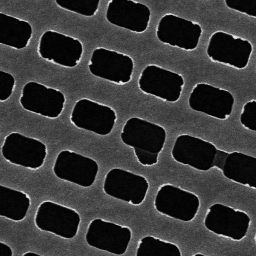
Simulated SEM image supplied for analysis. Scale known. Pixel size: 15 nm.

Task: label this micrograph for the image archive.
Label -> a regular array of holes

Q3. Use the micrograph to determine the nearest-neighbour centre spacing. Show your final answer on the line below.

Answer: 0.801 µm